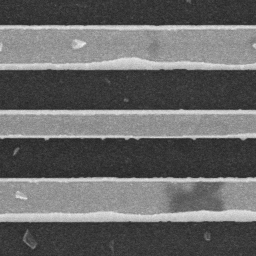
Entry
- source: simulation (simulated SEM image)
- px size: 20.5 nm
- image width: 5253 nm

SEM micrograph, lines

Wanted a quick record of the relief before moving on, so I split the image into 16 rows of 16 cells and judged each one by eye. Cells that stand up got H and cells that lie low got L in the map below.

LLLLLLLLLLLLLLLL
LLLLLLLLLLLLLLLL
HHHHHHHHHHHHHHHH
HHHHHHHHHHHHHHHH
LLLLLLLLLLLLLLLL
LLLLLLLLLLLLLLLL
LLLLLLLLLLLLLLLL
HHHHHHHHHHHHHHHH
HHHHHHHHHHHHHHHH
LLLLLLLLLLLLLLLL
LLLLLLLLLLLLLLLL
HHHHHHHHHHHHHHHH
HHHHHHHHHHHHHHHH
HHHHHHHHHHHHHHHH
LLLLLLLLLLLLLLLL
LLLLLLLLLLLLLLLL